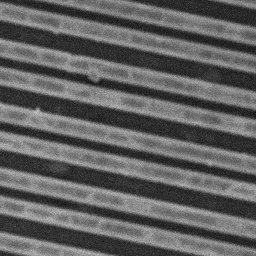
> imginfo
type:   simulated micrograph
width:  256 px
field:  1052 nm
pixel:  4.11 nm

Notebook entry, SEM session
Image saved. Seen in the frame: parallel lines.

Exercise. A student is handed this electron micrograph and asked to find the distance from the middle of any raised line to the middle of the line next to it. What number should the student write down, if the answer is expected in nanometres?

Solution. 129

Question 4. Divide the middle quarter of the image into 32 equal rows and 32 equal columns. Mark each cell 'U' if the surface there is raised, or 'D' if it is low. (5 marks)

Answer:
UUUUUUUUUUUUUUDDDDDDDDDDDDDDDDDD
DDUUUUUUUUUUUUUUUUDDDDDDDDDDDDDD
DDDDDDUUUUUUUUUUUUUUUUUDDDDDDDDD
DDDDDDUUUDDDDUUUUUUUUUUUUUUUDDDD
DDDDDDDDDDDDDDDDDUUUUUUUUUUUUUUU
UUUUUDDDDDDDDDDDDDDDDDUUUUUUUUUU
UUUUUUUUUDDDDDDDDDDDDDDDDDDUUUUU
UUUUUUUUUUUUUUDDDDDDDDDDDDDDDDDD
DDDUUUUUUUUUUUUUUUUDDDDDDDDDDDDD
DDDDDDDDUUUUUUUUUUUUUUUUDDDDDDDD
DDDDDDDDDDDDDUUUUUUUUUUUUUUUDDDD
DDDDDDDDDDDDDDDDDUUUUUUUUUUUUUUU
DDDDDDDDDDDDDDDDDDDDDDUUUUUUUUUU
DDDDDDDDDDDDDDDDDDDDDDDDDDDUUUUU
UUUUDDDDDDDDDDDDDDDDDDDDDDDDDDDD
UUUUUUUUUDDDDDDDDDDDDDDDDDDDDDDD
UUUUUUUUUUUUUDDDDDDDDDDDDDDDDDDD
DDDUUUUUUUUUUUUUUUDDDDDDDDDDDDDD
DDDDDDUUUUUUUUUUUUUUUUUDDDDDDDDD
DDDDDDDDDDDDUUUUUUUUUUUUUUUUDDDD
DDDDDDDDDDDDDDDDUUUUUUUUUUUUUUUU
UUUUDDDDDDDDDDDDDDDDDDUUUUUUUUUU
UUUUUUUUDDDDDDDDDDDDDDDDDDUUUUUU
UUUUUUUUUUUUUDDDDDDDDDDDDDDDDDDU
DDDUUUUUUUUUUUUUUUDDDDDDDDDDDDDD
DDDDDDDUUUUUUUUUUUUUUUUDDDDDDDDD
DDDDDDDDDDDDUUUUUUUUUUUUUUUDDDDD
DDDDDDDDDDDDDDDDDUUUUUUUUUUUUUUU
DDDDDDDDDDDDDDDDDDDDDDUUUUUUUUUU
DDDDDDDDDDDDDDDDDDDDDDDDDDUUUUUU
UUUDDDDDDDDDDDDDDDDDDDDDDDDDDDDU
UUUUUUUUDDDDDDDDDDDDDDDDDDDDDDDD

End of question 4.